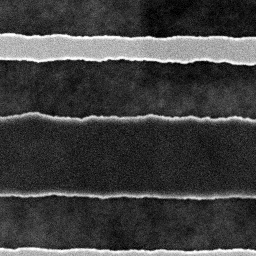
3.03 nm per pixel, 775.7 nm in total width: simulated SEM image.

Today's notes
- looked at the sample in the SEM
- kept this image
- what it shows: lines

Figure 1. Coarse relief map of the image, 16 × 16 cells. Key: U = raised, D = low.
DDDDDDDDDDDDDDDD
DDDDDDDDDDDDDDDD
UUUUUUUUUUUUUUUU
UUUUUUUUUUUUUUUU
DDDDDDDDDDDDDDDD
DDDDDDDDDDDDDDDD
DDDDDDDDDDDDDDDD
UUUUUUUUUUUUUUUU
UUUUUUUUUUUUUUUU
UUUUUUUUUUUUUUUU
UUUUUUUUUUUUUUUU
UUUUUUUUUUUUUUUU
DDDDDDDDDDDDDDDD
DDDDDDDDDDDDDDDD
DDDDDDDDDDDDDDDD
DDDDDDDDDDDDDDDD